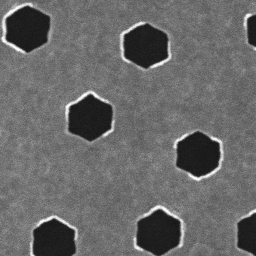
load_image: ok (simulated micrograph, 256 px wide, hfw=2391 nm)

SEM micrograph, holes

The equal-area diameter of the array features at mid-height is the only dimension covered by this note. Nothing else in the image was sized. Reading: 44.6 px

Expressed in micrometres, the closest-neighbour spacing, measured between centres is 0.937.